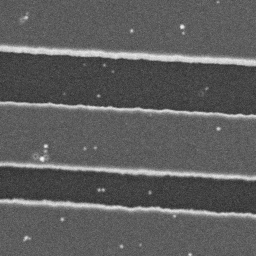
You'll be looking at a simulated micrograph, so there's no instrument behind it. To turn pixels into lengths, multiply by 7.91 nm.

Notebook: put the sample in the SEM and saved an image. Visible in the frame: lines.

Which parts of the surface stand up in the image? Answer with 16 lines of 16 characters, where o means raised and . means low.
oooooooooooooooo
oooooooooooooooo
oooooooooooooooo
.......ooooooooo
................
................
oo..............
oooooooooooooooo
oooooooooooooooo
oooooooooooooooo
....oooooooooooo
................
................
oooooooooooooooo
oooooooooooooooo
oooooooooooooooo